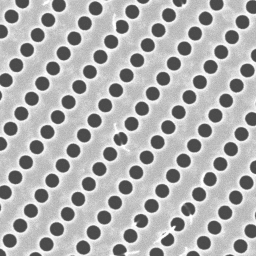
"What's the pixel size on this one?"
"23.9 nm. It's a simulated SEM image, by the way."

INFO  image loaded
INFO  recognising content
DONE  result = a regular array of holes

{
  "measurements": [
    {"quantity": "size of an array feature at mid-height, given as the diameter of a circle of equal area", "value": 350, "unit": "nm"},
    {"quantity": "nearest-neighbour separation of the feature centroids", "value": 438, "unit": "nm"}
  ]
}